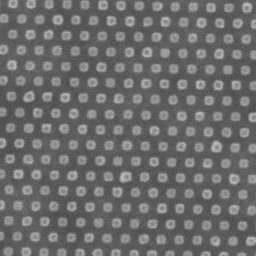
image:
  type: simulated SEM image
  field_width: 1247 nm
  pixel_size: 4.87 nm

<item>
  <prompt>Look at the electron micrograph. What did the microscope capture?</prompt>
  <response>a regular array of raised bodies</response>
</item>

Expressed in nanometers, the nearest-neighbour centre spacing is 85.1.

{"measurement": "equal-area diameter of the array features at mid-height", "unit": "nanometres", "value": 45.3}